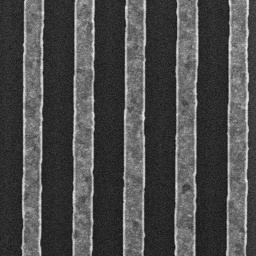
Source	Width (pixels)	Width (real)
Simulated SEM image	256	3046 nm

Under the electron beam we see lines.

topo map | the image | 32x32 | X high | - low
---XX----XXX----XX----XXX----XX-
---XX----XXX----XX----XXX----XX-
---XX----XXX----XX----XXX----XX-
---XX----XXX----XX----XXX----XX-
---XX----XXX----XX----XXX----XX-
---XX----XXX----XX----XXX----XX-
---XX----XXX----XX----XXX----XX-
---XX----XXX----XX----XXX----XX-
---XX----XXX----XX----XXX----XX-
---XX----XXX----XX----XXX----XX-
---XX----XXX----XX----XXX----XX-
---XX----XXX----XX----XX-----XX-
---XX----XXX----XX----XXX----XX-
---XX----XXX----XX----XXX----XX-
---XX----XXX----XX----XX-----XX-
---XX----XXX----XX----XX-----XX-
---XX----XXX----XX----XX-----XX-
---XX----XXX----XX----XX-----XX-
---XX----XXX----XX----XX-----XX-
---XX----XXX----XX----XX-----XX-
---XX----XXX----XX----XX-----XX-
---XX----XXX----XX----XX-----XX-
---XX----XXX---XXX----XX-----XX-
---XX----XXX---XXX----XX-----XX-
---XX----XXX---XXX----XX----XXX-
---XX----XX----XXX----XX----XXX-
---XX----XX----XXX----XX----XXX-
---XX----XXX---XXX----XX----XXX-
---XX----XX----XXX----XX----XXX-
---XX----XX----XXX----XX----XXX-
---XX----XX----XXX----XX----XXX-
---XX----XX----XXX----XX----XXX-